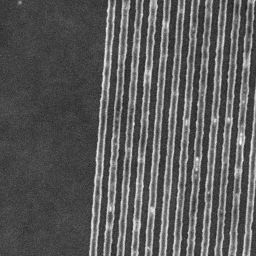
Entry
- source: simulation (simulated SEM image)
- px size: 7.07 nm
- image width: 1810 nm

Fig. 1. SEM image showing parallel lines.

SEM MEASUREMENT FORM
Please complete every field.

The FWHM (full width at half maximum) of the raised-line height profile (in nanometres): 48.5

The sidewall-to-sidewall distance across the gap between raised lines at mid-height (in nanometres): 48.5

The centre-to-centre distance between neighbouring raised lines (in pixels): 13.9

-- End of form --